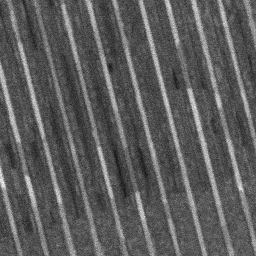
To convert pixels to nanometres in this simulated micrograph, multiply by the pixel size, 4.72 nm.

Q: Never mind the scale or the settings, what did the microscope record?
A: parallel lines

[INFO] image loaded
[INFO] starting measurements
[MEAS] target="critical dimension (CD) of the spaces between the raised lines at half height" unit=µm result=0.0378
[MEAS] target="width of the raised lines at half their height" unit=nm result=16.6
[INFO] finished